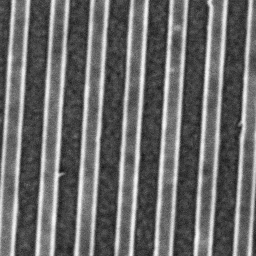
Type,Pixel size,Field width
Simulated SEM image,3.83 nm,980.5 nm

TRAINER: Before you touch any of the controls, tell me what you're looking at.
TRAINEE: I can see parallel lines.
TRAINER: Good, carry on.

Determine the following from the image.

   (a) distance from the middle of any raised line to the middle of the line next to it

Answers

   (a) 151 nanometers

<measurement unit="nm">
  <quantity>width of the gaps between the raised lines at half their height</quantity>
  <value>88.4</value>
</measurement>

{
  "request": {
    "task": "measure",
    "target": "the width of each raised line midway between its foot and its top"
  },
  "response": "0.0626 um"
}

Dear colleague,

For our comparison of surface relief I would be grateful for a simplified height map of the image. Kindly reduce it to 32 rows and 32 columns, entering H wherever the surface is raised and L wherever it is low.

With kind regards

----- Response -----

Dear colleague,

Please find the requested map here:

LLHHLLLHHLLHHLLLHHLLLHHLLLHHLLLH
LLHHLLHHLLLHHLLLHHLLLHHLLLHHLLLH
LHHLLLHHLLLHHLLLHHLLLHHLLLHHLLLH
LHHLLLHHLLLHHLLLHHLLLHHLLLHHLLLH
LHHLLLHHLLLHHLLLHHLLLHHLLLHHLLLH
LHHLLLHHLLLHHLLLHHLLLHHLLLHHLLLH
LHHLLLHHLLLHHLLLHHLLLHHLLLHHLLLH
LHHLLLHHLLLHHLLLHHLLLHHLLLHHLLLH
LHHLLLHHLLLHHLLLHHLLLHHLLLHHLLLH
LHHLLLHHLLLHHLLLHHLLLHHLLLHHLLLH
LHHLLLHHLLLHHLLLHHLLLHHLLLHHLLLH
LHHLLLHHLLLHHLLLHHLLLHHLLLHHLLLH
LHHLLLHHLLLHHLLLHHLLLHHLLLHHLLLH
LHHLLLHHLLLHHLLLHHLLLHHLLLHLLLHH
LHHLLLHHLLLHHLLLHHLLLHLLLHHLLLHH
LHHLLLHLLLLHHLLLHLLLHHLLLHHLLLHH
LHHLLLHLLLLHLLLHHLLLHHLLLHHLLLHH
LHHLLHHLLLHHLLLHHLLLHHLLLHHLLLHH
HHLLLHHLLLHHLLLHHLLLHHLLLHHLLLHH
HHLLLHHLLLHHLLLHHLLLHHLLLHHLLLHH
HHLLLHHLLLHHLLLHHLLLHHLLLHHLLLHH
HHLLLHHLLLHHLLLHHLLLHHLLLHHLLLHH
HHLLLHHLLLHHLLLHHLLLHHLLLHHLLLHH
HHLLLHHLLLHHLLLHHLLLHHLLLHHLLLHH
HHLLLHHLLLHHLLLHHLLLHHLLLHHLLLHH
HHLLLHHLLLHHLLLHHLLLHHLLLHHLLLHH
HHLLLHHLLLHHLLLHHLLLHHLLLHHLLLHH
HHLLLHHLLLHHLLLHHLLLHHLLLHHLLLHH
HHLLLHHLLLHHLLLHHLLLHHLLLHHLLLHH
HHLLLHHLLLHHLLLHHLLLHHLLLHLLLHHL
HHLLLHHLLLHHLLLHHLLLHLLLHHLLLHHL
HHLLLHHLLHHHLLLHLLLHHLLLHHLLLHHL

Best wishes